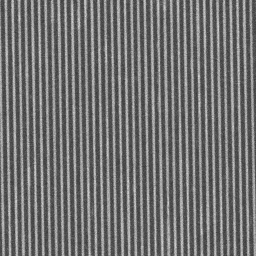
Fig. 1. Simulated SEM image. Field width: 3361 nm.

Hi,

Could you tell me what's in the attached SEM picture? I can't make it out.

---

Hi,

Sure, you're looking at parallel lines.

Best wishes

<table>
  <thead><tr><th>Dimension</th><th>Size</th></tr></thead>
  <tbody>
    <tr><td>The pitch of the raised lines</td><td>6.61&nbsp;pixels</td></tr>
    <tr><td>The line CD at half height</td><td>0.0246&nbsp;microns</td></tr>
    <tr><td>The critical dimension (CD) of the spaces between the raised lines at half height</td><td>64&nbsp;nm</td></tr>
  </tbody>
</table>